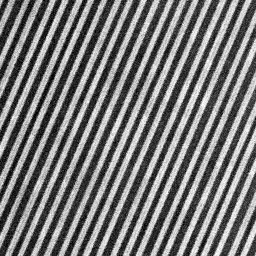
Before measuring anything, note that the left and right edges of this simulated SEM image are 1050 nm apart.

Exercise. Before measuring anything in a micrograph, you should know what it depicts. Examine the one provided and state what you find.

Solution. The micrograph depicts parallel lines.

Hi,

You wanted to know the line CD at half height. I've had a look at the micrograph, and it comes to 4.71 pixels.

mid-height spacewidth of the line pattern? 30.6 nm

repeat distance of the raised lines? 49.3 nm